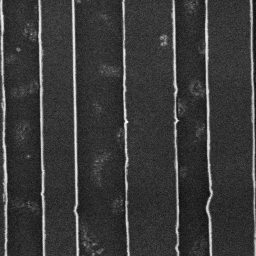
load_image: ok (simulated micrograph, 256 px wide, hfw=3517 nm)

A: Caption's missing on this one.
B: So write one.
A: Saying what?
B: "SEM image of one or a few lines or trenches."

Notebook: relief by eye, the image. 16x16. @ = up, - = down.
--@@@---@@@--@@@
---@@---@@@--@@@
--@@@---@@@--@@@
---@@---@@@--@@@
---@@---@@@--@@@
---@@---@@@--@@@
---@@---@@@--@@@
---@@---@@@--@@@
---@@---@@@--@@@
---@@---@@@--@@@
---@@---@@@--@@@
---@@---@@@--@@@
---@@---@@@--@@@
---@@---@@@--@@@
---@@---@@@--@@@
---@@---@@@--@@@